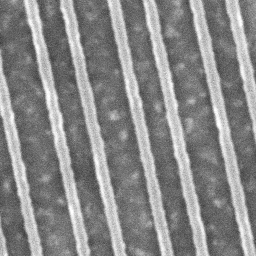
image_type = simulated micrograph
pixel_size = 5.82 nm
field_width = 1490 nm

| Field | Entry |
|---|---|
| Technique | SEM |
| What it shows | parallel lines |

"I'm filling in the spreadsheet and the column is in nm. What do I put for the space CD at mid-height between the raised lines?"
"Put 200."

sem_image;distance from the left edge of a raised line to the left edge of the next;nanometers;238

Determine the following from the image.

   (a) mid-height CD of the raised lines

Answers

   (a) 59.7 nm